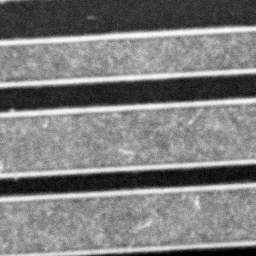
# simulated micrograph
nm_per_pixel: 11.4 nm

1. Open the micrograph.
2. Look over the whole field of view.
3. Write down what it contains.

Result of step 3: one or a few lines or trenches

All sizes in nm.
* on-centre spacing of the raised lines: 938